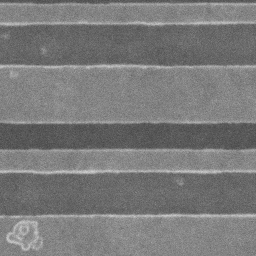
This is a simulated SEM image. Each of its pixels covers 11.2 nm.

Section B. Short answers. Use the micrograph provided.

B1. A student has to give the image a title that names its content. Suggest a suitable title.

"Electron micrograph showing lines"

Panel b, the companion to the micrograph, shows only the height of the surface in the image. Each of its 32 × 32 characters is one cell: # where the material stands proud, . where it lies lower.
........................######.#
################################
################################
................................
................................
................................
................................
................................
################################
################################
################################
################################
################################
################################
################################
................................
................................
................................
................................
################################
################################
................................
................................
................................
................................
................................
................................
################################
################################
################################
################################
################################